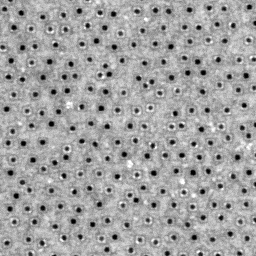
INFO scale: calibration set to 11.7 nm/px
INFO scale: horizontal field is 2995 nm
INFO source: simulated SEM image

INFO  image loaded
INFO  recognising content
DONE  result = a regular array of holes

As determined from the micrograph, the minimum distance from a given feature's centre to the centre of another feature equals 178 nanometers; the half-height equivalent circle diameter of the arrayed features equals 71.1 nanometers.